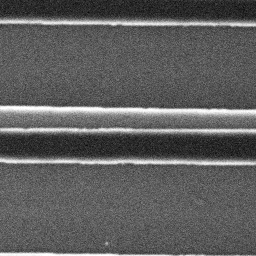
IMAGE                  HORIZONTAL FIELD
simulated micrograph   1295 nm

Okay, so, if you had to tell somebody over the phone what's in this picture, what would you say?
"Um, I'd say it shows lines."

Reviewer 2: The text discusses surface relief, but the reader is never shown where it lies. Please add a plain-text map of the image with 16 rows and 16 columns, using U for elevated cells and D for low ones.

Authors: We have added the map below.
UUUUUUUUUUUUUUUU
DDDDDDDUUUUUUUUU
DDDDDDDDDDDDDDDD
DDDDDDDDDDDDDDDD
DDDDDDDDDDDDDDDD
DDDDDDDDDDDDDDDD
DDDDDDDDDDDDDDDD
UUUUUUUUUUUUUUUU
UUUUUUUUUUUUUUUU
UUUUUUUUUUUUUUUU
DDDDDDDDDDDDDDDD
DDDDDDDDDDDDDDDD
DDDDDDDDDDDDDDDD
DDDDDDDDDDDDDDDD
DDDDDDDDDDDDDDDD
DDDDDDDDDDDDDDDD